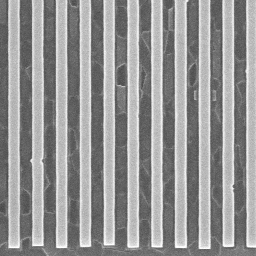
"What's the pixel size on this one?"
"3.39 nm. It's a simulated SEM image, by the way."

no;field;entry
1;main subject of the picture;parallel lines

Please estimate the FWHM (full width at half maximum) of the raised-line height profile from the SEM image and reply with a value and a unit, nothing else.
10.1 px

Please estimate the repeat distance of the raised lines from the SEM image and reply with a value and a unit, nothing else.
80.7 nm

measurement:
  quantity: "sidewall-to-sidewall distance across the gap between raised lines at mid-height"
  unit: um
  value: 0.0462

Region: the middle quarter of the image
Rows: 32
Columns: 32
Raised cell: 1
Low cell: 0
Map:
10001100001100001110001100001110
10001100001100001110001100001100
10001100001100001110001100001110
10001100001100001110001100001100
10001100001110001110001100001100
10001100001110001110001100001100
10001110001100001110001100001100
10001110001100001110001100001100
10001110001100001110001100001100
10001110001110001110001100001100
10001110001110001110001100001100
10001110001110001110001100001100
10001110001110001110001100001100
10001110001110001110001100001110
10001110001110001110001100001110
10001100001110001110001100001100
10001100001110001110001100001100
10001100001110001110001100001100
10001100001110001110001100001100
10001100001110001110001100001100
10001110001110001110001100001100
10001110001110001110001100001110
10001110001110001110001100001100
10001100001110001110001100001100
10001100001110001110001100001100
10001100001110001110001100001100
10001110001100001110001100001100
10001110001100001110001100001100
10001110001100001110001100001100
10001110001100001110001100001100
10001110001100001110001100001100
10001110001110001110001100001100